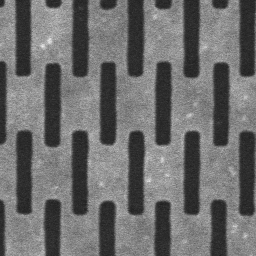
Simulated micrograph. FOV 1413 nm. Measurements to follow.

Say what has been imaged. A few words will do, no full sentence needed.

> a regular array of holes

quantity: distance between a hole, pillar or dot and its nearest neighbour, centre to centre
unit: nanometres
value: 307